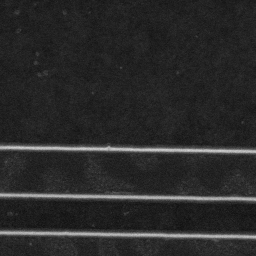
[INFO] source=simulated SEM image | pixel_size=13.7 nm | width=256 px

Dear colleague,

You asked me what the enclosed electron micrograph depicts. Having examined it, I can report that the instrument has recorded one or a few lines or trenches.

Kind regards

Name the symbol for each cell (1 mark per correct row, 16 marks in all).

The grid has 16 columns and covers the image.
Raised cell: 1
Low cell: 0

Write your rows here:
0000000000000000
0000000000000000
0000000000000000
0000000000000000
0000000000000000
0000000000000000
0000000000000000
0000000000000000
0000000000000000
1111111111111111
1111111111111111
1111111111111111
0000000000000000
0000000000000000
0000000000000000
1111111111111111